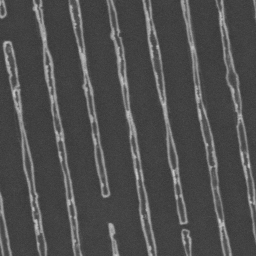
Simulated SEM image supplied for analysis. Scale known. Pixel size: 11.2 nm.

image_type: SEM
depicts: parallel lines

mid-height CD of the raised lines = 73.5 nm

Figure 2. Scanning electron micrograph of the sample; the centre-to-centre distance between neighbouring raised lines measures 404 nanometers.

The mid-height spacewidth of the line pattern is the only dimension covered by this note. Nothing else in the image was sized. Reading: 337 nm